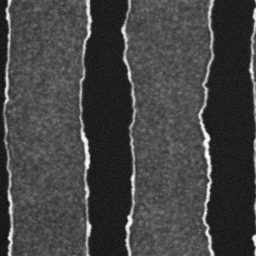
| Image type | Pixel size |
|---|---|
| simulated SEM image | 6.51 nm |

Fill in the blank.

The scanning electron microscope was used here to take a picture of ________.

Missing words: one or a few lines or trenches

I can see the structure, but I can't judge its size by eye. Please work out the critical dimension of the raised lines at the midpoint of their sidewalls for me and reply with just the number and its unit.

304 nm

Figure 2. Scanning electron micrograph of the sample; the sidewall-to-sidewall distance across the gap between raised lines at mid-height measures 492 nanometres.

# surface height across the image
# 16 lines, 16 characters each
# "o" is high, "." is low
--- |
o....ooo.....ooo
o.....oo.....ooo
o....ooo.....ooo
o....ooo.....ooo
.....ooo.....ooo
.....ooo.....ooo
.....ooo.....ooo
.....ooo.....ooo
.....ooo.....ooo
o....ooo.....ooo
o....ooo.....ooo
o....ooo.....ooo
o....ooo.....ooo
o....ooo.....ooo
o....ooo.....ooo
o....ooo.....ooo